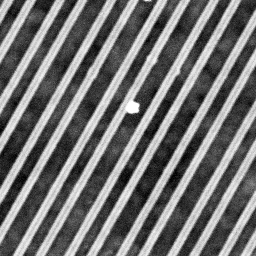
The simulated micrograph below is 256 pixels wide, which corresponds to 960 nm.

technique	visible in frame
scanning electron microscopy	parallel lines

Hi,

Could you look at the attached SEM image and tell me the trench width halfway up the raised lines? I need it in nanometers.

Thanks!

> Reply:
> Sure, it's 52.6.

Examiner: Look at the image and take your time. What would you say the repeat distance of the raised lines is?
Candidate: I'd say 22.3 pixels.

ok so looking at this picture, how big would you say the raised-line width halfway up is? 23.2 nanometres